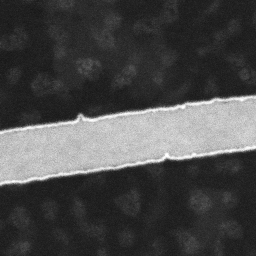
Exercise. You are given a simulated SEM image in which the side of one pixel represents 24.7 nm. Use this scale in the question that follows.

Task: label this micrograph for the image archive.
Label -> one or a few lines or trenches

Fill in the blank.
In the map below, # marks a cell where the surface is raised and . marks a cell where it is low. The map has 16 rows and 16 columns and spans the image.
################
################
################
################
################
################
############....
#####...........
................
..............##
.......#########
################
################
################
################
################